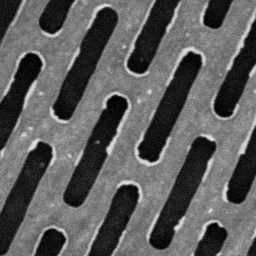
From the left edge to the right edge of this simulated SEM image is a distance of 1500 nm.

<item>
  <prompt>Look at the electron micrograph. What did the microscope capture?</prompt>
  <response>holes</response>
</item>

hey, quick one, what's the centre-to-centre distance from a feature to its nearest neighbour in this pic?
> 505 nm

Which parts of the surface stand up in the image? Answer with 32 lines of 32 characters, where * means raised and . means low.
...***...**********...****...***
..***....***..*****...****...***
..***...****...***...****...****
.****...***...****...*****.****.
.**********...***...***********.
**********...****...**********..
**********...****...**********..
***..****....***...****..****...
**...****...****...***...****...
**...***....**********...***...*
*...****...**********...****...*
*..****....**********...***...**
...****...***...****...****...**
...****...***...****...****..***
..*****..***...****...*****..***
..**********...****...**********
..*********....***...***********
.**********...****...***..*****.
****..*****..****...****...****.
***....***...****...***....***..
***...****...**********...****..
**....***...**********....***...
**...****...**********...****...
*....***....***..****....***...*
*...****...***...****...****...*
*...****..****...****...*****.**
...**********....***...*********
...**********...****...*********
..**********....***...****..****
..***...****...****...***...****
..***...***....****..****...***.
.***...****...**********...****.